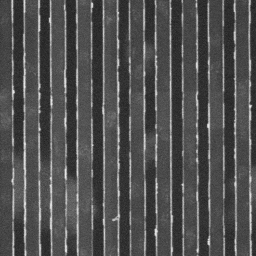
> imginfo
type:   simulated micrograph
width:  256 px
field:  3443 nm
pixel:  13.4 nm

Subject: parallel lines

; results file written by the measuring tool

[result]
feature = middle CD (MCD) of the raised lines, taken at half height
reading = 12.1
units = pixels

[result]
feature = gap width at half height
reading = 187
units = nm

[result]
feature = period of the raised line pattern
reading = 354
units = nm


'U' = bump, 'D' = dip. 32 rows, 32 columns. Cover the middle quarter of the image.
UUUDDDDUUUDDDUUUDDDDUUUDDDDUUUDD
UUUDDDDUUUDDDUUUDDDDUUUDDDDUUUDD
UUUDDDDUUUDDDUUUDDDDUUUDDDDUUUDD
UUUDDDDUUUDDDUUUDDDDUUUDDDDUUUDD
UUUDDDDUUUDDDUUUDDDDUUUDDDDUUUDD
UUUDDDDUUUDDDDUUDDDDUUUDDDDUUUDD
UUUDDDDUUUDDDDUUDDDDUUUDDDDUUUDD
UUUDDDDUUUDDDDUUDDDDUUUDDDDUUUDD
UUUDDDDUUUDDDDUUDDDDUUUDDDDUUUDD
UUUDDDDUUUDDDDUUDDDDUUUDDDDUUUDD
UUUDDDDUUUDDDDUUDDDDUUUDDDDUUUDD
UUUDDDDUUUDDDDUUDDDDUUUDDDDUUUDD
UUUDDDDUUUDDDDUUDDDDUUUDDDDUUUDD
UUUDDDDUUUDDDDUUDDDDUUUDDDDUUUDD
UUUDDDDUUUDDDDUUDDDDUUUDDDDUUUDD
UUUDDDDUUUDDDDUUDDDDUUUDDDDUUUDD
UUUDDDDUUUDDDDUUDDDDUUUDDDDUUUDD
UUUDDDDUUUDDDDUUDDDDUUUDDDDUUUDD
DUUDDDDUUUDDDDUUDDDDUUUDDDDUUUDD
DUUDDDDUUUDDDDUUDDDDUUUDDDDUUUDD
DUUDDDDUUUDDDDUUDDDDUUUDDDDUUUDD
DUUDDDDUUUDDDDUUUDDDUUUDDDDUUUDD
DUUDDDDUUUDDDDUUUDDDUUUDDDDUUUDD
DUUDDDDUUUDDDDUUUDDDUUUDDDDUUUDD
DUUDDDDUUUDDDDUUUDDDUUUDDDDUUUDD
DUUDDDDUUUDDDDUUUDDDUUUDDDDUUUDD
DUUDDDDUUUDDDDUUUDDDUUUDDDDUUUDD
DUUDDDDUUUDDDDUUUDDDUUUDDDDUUUDD
DUUDDDDUUUDDDDUUUDDDUUUDDDDUUUDD
DUUDDDDUUUDDDDUUUDDDUUUDDDDUUUDD
DUUDDDDUUUDDDDUUUDDDUUUDDDDUUUDD
DUUDDDDUUUDDDDUUUDDDUUUDDDDUUUDD